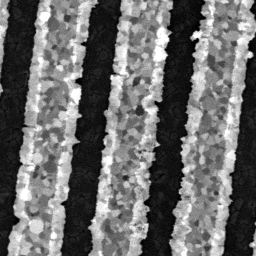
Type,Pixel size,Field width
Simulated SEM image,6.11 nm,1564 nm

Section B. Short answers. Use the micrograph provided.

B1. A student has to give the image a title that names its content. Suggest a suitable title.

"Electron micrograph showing one or a few lines or trenches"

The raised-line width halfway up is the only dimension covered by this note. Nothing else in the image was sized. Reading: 244 nm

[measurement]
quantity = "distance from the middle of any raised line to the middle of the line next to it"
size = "80.8 px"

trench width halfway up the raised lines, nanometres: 250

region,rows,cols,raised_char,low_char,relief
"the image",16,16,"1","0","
0001100011000110
0001100011000111
0001100011000110
0011100011000110
0011100111001110
0011100111001110
0011100110001110
0011100110001110
0011000110001100
0011000110001100
0011000110001100
0111000110001100
0111001110001100
0111001110011100
0111001110011100
0110001100011100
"